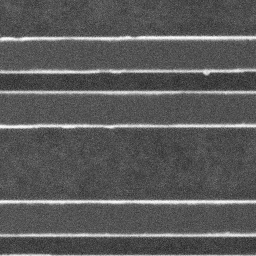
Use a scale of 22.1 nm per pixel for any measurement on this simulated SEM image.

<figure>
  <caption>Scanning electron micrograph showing lines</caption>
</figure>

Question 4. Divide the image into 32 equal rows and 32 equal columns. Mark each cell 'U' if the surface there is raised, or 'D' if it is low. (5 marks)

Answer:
DDDDDDDDDDDDDDDDDDDDDDDDDDDDDDDD
DDDDDDDDDDDDDDDDDDDDDDDDDDDDDDDD
DDDDDDDDDDDDDDDDDDDDDDDDDDDDDDDD
DDDDDDDDDDDDDDDDDDDDDDDDDDDDDDDD
DDDDDDDDDDDDDDDDDDDDDDDDDDDDDDDD
UUUUUUUUUUUUUUUUUUUUUUUUUUUUUUUU
UUUUUUUUUUUUUUUUUUUUUUUUUUUUUUUU
UUUUUUUUUUUUUUUUUUUUUUUUUUUUUUUU
UUUUUUUUUUUUUUUUUUUUUUUUUUUUUUUU
DDDDDDDDDDDDDDDDDDDDDDDDDDDDDDDD
DDDDDDDDDDDDDDDDDDDDDDDDDDDDDDDD
UUUUUUUUUUUUUUUUUUUUUUUUUUUUUUUU
UUUUUUUUUUUUUUUUUUUUUUUUUUUUUUUU
UUUUUUUUUUUUUUUUUUUUUUUUUUUUUUUU
UUUUUUUUUUUUUUUUUUUUUUUUUUUUUUUU
UUUUUUUUUUUUUUUUUUUUUUUUUUUUUUUU
DDDDDDDDDDDDDDDDDDDDDDDDDDDDDDDD
DDDDDDDDDDDDDDDDDDDDDDDDDDDDDDDD
DDDDDDDDDDDDDDDDDDDDDDDDDDDDDDDD
DDDDDDDDDDDDDDDDDDDDDDDDDDDDDDDD
DDDDDDDDDDDDDDDDDDDDDDDDDDDDDDDD
DDDDDDDDDDDDDDDDDDDDDDDDDDDDDDDD
DDDDDDDDDDDDDDDDDDDDDDDDDDDDDDDD
DDDDDDDDDDDDDDDDDDDDDDDDDDDDDDDD
DDDDDDDDDDDDDDDDDDDDDDDDDDDDDDDD
UUUUUUUUUUUUUUUUUUUUUUUUUUUUUUUU
UUUUUUUUUUUUUUUUUUUUUUUUUUUUUUUU
UUUUUUUUUUUUUUUUUUUUUUUUUUUUUUUU
UUUUUUUUUUUUUUUUUUUUUUUUUUUUUUUU
DDDDDDDDDDDDDDDDDDDDDDDDDDDDDDDD
DDDDDDDDDDDDDDDDDDDDDDDDDDDDDDDD
DDDDDDDDDDDDDDDDDDDDDDDDDDDDDDDD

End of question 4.